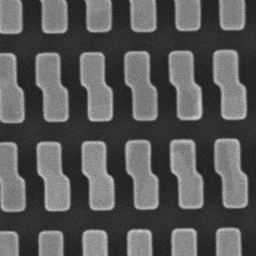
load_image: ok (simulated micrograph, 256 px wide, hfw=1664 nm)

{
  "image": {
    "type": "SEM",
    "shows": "wiring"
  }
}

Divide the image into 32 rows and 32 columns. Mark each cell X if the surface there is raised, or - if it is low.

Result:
XXX--XXX---XXX--XXX---XXX--XXXX-
XXX--XXX---XXX--XXX---XXX--XXXX-
XXX--XXX---XXX--XXX---XXX---XXX-
XXX--XXX---XXX---XX---XXX---XX--
--------------------------------
--------------------------------
----------------------XX---XX---
XX---XX---XXX---XXX--XXX---XXX--
XX---XX---XXX---XXX--XXX---XXX--
XX---XX---XXX---XXX--XXX---XXX--
XX---XXX--XXX---XXX---XXX--XXX--
XXX--XXX---XXX--XXXX--XXX---XXX-
XXX--XXX---XXX---XXX--XXX---XXX-
XXX--XXX---XXX---XXX--XXX---XXX-
XXX---XX---XXX---XXX--XXX---XXX-
--------------------------------
--------------------------------
---------------------------XX---
XX---XXX--XXX---XXX--XXX---XXX--
XX---XXX--XXX---XXX--XXX---XXX--
XX---XXX--XXX---XXX--XXX---XXX--
XX---XXX--XXX---XXX---XXX--XXX--
XXX--XXX---XXX---XXX--XXX---XXX-
XXX---XXX--XXX---XXX--XXX---XXX-
XXX---XXX--XXX---XXX--XXX---XXX-
XXX---XXX--XXX---XXX--XXX---XXX-
--------------------------------
--------------------------------
--------------------------------
XX---XXX--XXX---XXX--XXX---XXX--
XX---XXX--XXX---XXX--XXX---XXX--
XX---XXX--XXX---XXX---XX---XXX--